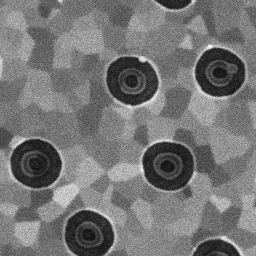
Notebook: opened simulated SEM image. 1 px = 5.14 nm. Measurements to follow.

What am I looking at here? ring-shaped grooves with a dot in the middle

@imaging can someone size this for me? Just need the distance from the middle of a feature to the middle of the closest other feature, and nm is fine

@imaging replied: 463